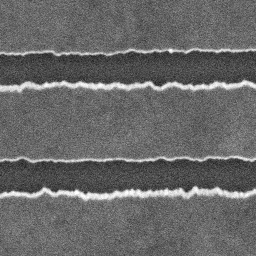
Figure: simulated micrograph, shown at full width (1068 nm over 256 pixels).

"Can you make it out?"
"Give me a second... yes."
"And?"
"lines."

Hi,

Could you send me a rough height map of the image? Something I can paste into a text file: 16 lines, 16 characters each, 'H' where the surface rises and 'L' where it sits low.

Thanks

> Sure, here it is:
HHHHHHHHHHHHHHHH
HHHHHHHHHHHHHHHH
HHHHHHHHHHHHHHHH
LLLLLLLLLLLLLLLL
LLLLLLLLLLLLLLLL
HHHHHHHHHHHHHHHH
HHHHHHHHHHHHHHHH
HHHHHHHHHHHHHHHH
HHHHHHHHHHHHHHHH
HHHHHHHHHHHHHHHH
LLLLLLLLLLLLLLLL
LLLLLLLLLLLLLLLL
HHHHHHHHHHHHHHHH
HHHHHHHHHHHHHHHH
HHHHHHHHHHHHHHHH
HHHHHHHHHHHHHHHH